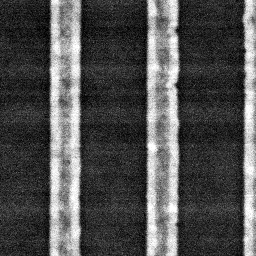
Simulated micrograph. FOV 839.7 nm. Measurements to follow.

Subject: one or a few lines or trenches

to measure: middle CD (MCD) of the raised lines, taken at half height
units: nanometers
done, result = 72.2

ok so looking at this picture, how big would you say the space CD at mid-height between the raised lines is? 0.249 microns